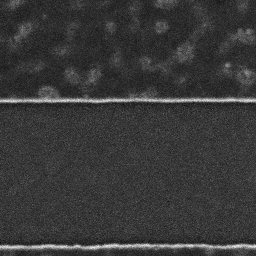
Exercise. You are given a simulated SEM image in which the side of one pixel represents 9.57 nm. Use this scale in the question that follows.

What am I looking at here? one or a few lines or trenches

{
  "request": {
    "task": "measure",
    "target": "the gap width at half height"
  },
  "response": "1390 nm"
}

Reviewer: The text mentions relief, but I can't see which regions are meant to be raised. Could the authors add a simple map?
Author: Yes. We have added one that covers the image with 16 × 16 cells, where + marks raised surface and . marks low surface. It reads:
++++++++++++++++
++++++++++++++++
++++++++++++++++
++++++++++++++++
++++++++++++++++
++++++++++++++++
................
................
................
................
................
................
................
................
................
++++++++++++++++